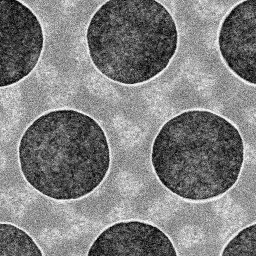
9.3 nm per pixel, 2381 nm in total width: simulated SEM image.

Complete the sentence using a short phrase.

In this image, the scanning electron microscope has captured holes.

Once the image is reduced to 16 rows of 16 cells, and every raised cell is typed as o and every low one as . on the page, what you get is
..oooo....ooooo.
..oooo.....ooo..
...oo......ooo..
..oooo.....ooo..
..oooo....ooooo.
oooooooooooooooo
oooooooooooooooo
oo....ooooo...oo
o......ooo.....o
o......ooo.....o
o......ooo.....o
oo....oooo.....o
oooooooooooo.ooo
oooooooooooooooo
..oooo....ooooo.
..oooo.....ooo..